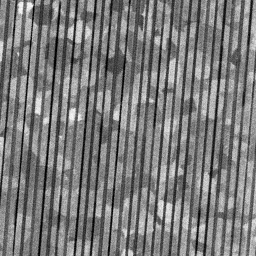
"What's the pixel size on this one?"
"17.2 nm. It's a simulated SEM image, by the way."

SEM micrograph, parallel lines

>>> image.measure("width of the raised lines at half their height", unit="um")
0.101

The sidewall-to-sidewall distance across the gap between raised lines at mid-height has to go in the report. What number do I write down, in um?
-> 0.0514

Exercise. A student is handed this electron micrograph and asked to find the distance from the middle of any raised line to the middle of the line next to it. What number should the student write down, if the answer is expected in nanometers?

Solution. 149